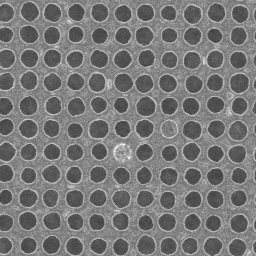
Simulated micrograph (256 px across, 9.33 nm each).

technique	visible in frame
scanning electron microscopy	a regular array of holes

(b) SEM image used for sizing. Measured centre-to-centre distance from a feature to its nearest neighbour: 208 nm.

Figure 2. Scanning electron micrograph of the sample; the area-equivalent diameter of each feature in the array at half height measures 17.1 px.